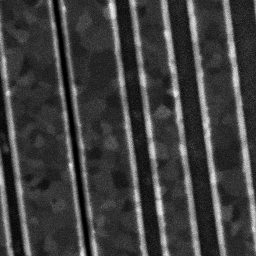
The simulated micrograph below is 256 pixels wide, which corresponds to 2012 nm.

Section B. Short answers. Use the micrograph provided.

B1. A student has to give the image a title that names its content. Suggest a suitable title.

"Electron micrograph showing one or a few lines or trenches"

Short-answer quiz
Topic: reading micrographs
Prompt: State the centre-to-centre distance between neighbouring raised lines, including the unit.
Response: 480 nm